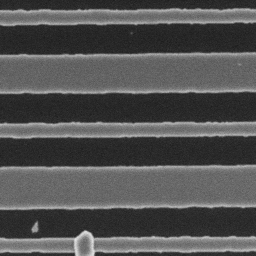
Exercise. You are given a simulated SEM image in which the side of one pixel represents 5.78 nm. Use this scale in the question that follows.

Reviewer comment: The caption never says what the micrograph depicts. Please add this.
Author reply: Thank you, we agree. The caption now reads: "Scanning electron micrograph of lines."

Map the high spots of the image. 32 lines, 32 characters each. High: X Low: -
--------------------------------
XXXXXXXXXXXXXXXXXXXXXXXXXXXXXXXX
XXXXXXXXXXXXXXXXXXXXXXXXXXXXXXXX
--------------------------------
--------------------------------
--------------------------------
--------------------------------
XXXXXXXXXXXXXXXXXXXXXXXXXXXXXXXX
XXXXXXXXXXXXXXXXXXXXXXXXXXXXXXXX
XXXXXXXXXXXXXXXXXXXXXXXXXXXXXXXX
XXXXXXXXXXXXXXXXXXXXXXXXXXXXXXXX
XXXXXXXXXXXXXXXXXXXXXXXXXXXX----
--------------------------------
--------------------------------
--------------------------------
X--XXX-XXXXXXXXXXXXXXXXXXXXXXXXX
XXXXXXXXXXXXXXXXXXXXXXXXXXXXXXXX
--------------------------------
--------------------------------
--------------------------------
--------------------------------
XXXXXXXXXXXXXXXXXXXXXXXXXXXXXXXX
XXXXXXXXXXXXXXXXXXXXXXXXXXXXXXXX
XXXXXXXXXXXXXXXXXXXXXXXXXXXXXXXX
XXXXXXXXXXXXXXXXXXXXXXXXXXXXXXXX
XXXXXXXXXXXXXXXXXXXXXXXXXXXXXXXX
--------------------------------
--------------------------------
----X---------------------------
----------XX--------------------
XXXXXXXXXXXXXXXXXXXXXXXXXXXXXXXX
XXXX-XXXXXXX-XXXXX-XX-XXX-------